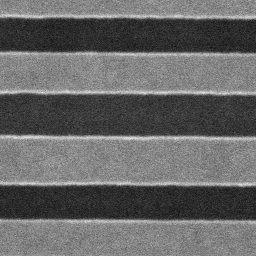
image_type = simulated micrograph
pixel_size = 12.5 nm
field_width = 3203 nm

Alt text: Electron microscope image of lines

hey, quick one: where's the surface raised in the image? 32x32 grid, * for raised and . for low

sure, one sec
********************************
********************************
................................
................................
................................
................................
................................
********************************
********************************
********************************
********************************
**..****************************
................................
................................
................................
................................
................................
********************************
********************************
********************************
********************************
********************************
********************************
................................
................................
................................
................................
................................
********************************
********************************
********************************
********************************